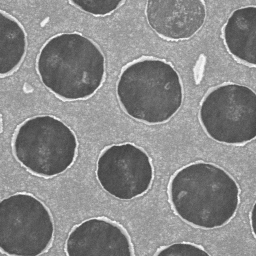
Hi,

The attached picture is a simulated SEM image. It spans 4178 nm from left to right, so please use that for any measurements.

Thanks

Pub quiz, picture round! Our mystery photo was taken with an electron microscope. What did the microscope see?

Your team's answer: holes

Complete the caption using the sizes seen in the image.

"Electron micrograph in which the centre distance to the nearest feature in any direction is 1360 nm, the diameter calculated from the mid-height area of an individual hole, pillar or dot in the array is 1.04 µm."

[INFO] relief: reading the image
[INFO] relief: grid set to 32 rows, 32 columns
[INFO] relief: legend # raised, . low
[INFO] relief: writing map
#########......#####.....#######
###########...#####.......###...
..#################......####...
..#################......###....
...####...###########...####....
...###......################....
...##........################...
...##........#################..
..###........###......##########
#####........##.......##########
######......###.......##########
#######.....###........###......
###############........###......
###############.......###.......
################.....####.......
###.....#################.......
##.......#################......
##.......##################....#
##.......#####...###############
##.......####.....##############
###......###.......#####..######
####....####.......###......####
############.......###.......###
#############.....###.........##
##..##########...####.........##
.....#################........##
......################.......##.
.......####.###########......##.
.......###.....##########..#####
.......##.......################
......##........######.#########
#....###.........###......######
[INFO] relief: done